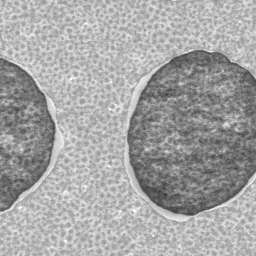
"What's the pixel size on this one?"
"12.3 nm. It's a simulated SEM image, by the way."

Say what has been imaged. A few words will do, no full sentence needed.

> holes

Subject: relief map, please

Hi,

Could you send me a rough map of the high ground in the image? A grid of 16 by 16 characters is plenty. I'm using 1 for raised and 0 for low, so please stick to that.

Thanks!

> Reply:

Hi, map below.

1111111111111111
1111111111111111
1111111111111111
1111111111100011
0011111111000000
0011111110000000
0001111100000000
0001111100000000
0000111100000000
0001111100000000
0001111100000000
0011111100000001
0111111110000011
1111111111101111
1111111111111111
1111111111111111